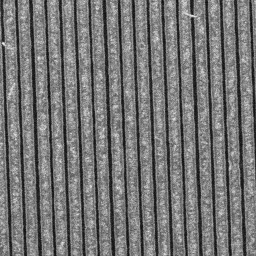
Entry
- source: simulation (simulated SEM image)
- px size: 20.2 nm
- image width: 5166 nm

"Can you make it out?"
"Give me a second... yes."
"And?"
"parallel lines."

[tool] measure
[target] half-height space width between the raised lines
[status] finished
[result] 58 nm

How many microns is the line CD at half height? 0.229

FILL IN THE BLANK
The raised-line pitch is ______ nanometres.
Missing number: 295